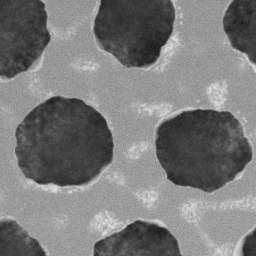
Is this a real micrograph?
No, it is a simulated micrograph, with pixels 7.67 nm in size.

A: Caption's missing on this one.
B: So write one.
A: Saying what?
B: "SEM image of holes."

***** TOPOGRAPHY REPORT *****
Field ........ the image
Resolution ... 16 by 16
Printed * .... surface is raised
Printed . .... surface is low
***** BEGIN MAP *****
...***.....***..
...***.....***..
...***....****..
...****...*****.
..**************
****************
***..***********
*......***.....*
*......***.....*
*......***......
*......***.....*
***..******...**
****************
****************
..*****....*****
...***.....****.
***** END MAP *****